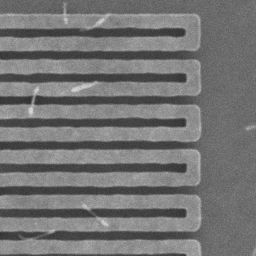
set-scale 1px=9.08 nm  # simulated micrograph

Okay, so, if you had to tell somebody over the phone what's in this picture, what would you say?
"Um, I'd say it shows groups of lines, slits or small figures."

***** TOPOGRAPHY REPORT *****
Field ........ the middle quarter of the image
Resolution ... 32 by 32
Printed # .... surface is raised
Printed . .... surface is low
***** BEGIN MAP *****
################################
################################
..............................##
...............................#
.......##......................#
################################
################################
################################
................................
................................
################################
################################
################################
##############......#########.##
...............................#
..............................##
################################
################################
################################
................................
................................
...####..........###.......#####
################################
################################
################################
...............................#
...............................#
################################
################################
################################
........####....................
................................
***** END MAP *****